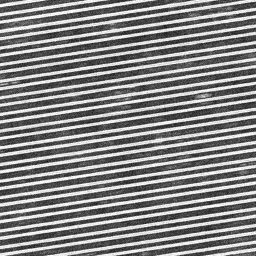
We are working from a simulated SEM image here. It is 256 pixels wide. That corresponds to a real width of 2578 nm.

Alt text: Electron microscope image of parallel lines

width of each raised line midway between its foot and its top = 21.2 nanometres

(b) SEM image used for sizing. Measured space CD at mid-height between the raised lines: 56 nm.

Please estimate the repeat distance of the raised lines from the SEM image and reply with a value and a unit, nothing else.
82.6 nm